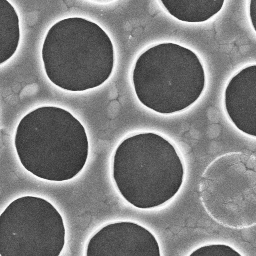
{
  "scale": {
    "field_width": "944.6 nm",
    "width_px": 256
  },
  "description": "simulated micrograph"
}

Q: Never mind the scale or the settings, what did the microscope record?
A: holes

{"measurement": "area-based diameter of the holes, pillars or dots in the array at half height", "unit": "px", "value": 73.7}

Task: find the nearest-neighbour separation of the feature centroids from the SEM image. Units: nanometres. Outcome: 344